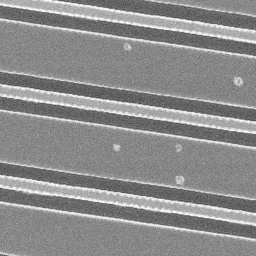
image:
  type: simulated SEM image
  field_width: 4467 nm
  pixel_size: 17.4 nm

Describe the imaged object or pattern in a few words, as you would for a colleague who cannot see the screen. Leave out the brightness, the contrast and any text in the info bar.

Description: lines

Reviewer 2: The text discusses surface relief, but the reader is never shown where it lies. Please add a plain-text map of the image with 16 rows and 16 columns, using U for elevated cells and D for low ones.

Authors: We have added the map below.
DDDDDDDDDDDDDUUU
UUDDDDDDDDDDDDDD
UUUUUUUUUDDDDDDD
UUUUUUUUUUUUUUUU
UUUUUUUUUUUUUUUU
DDDDDDDUUUUUUUUU
DDDDDDDDDDDDDDUU
UUUUDDDDDDDDDDDD
UUUUUUUUUUUDDDDD
UUUUUUUUUUUUUUUU
DDUUUUUUUUUUUUUU
DDDDDDDDDUUUUUUU
DDDDDDDDDDDDDDDD
UUUUUUDDDDDDDDDD
UUUUUUUUUUUUUDDD
UUUUUUUUUUUUUUUU